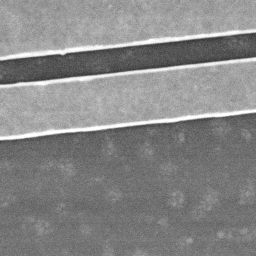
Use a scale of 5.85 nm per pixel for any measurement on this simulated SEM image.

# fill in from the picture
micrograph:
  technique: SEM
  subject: one or a few lines or trenches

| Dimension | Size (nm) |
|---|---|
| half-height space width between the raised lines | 161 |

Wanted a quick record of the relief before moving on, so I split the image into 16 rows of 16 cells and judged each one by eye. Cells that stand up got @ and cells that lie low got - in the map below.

@@@@@@@@@@@@@@@@
@@@@@@@@@@@@@@@@
@@@@@@@@@@@-----
@---------------
---------@@@@@@@
@@@@@@@@@@@@@@@@
@@@@@@@@@@@@@@@@
@@@@@@@@@@@-----
@@--------------
----------------
----------------
----------------
----------------
----------------
----------------
----------------